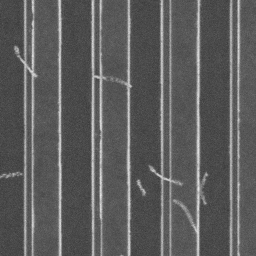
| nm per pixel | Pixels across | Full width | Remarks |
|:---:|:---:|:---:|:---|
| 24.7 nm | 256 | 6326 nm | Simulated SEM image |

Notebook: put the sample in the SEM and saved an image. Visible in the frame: lines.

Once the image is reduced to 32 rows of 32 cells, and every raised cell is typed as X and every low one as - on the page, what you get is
---XXXX-----XXXX----XXXXX----XXX
---XXXX-----XXXX----XXXXX----XXX
---XXXX-----XXXX----XXXXX----XXX
---XXXX-----XXXX----XXXXX----XXX
---XXXX-----XXXX----XXXXX----XXX
---XXXX-----XXXX----XXXXX----XXX
---XXXX-----XXXX----XXXXX----XXX
---XXXX-----XXXX----XXXXX----XXX
---XXXX-----XXXX----XXXXX----XXX
---XXXX-----XXXX----XXXXX----XXX
---XXXX-----XXXX----XXXXX----XXX
---XXXX-----XXXX----XXXXX----XXX
---XXXX-----XXXX----XXXXX----XXX
---XXXX-----XXXX----XXXXX----XXX
---XXXX-----XXXX----XXXXX----XXX
---XXXX-----XXXX----XXXXX----XXX
---XXXX-----XXXX----XXXXX----XXX
---XXXX-----XXXX----XXXXX----XXX
---XXXX-----XXXX----XXXXX----XXX
---XXXX-----XXXX----XXXXX----XXX
---XXXX-----XXXX----XXXXX----XXX
---XXXX-----XXXX----XXXXX----XXX
---XXXX-----XXXX----XXXXX----XXX
---XXXX-----XXXX----XXXXX----XXX
---XXXX-----XXXX----XXXXX----XXX
---XXXX-----XXXX----XXXXX----XXX
---XXXX-----XXXX----XXXXX----XXX
---XXXX-----XXXX----XXXXX----XXX
---XXXX-----XXXX----XXXXX----XXX
---XXXX-----XXXX----XXXXX----XXX
---XXXX-----XXXX----XXXXX----XXX
---XXXX-----XXXX----XXXXX----XXX